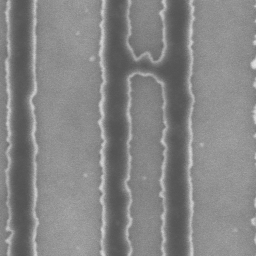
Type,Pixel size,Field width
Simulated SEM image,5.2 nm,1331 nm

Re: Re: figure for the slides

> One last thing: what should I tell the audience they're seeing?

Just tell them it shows one or a few lines or trenches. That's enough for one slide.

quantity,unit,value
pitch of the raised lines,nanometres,404